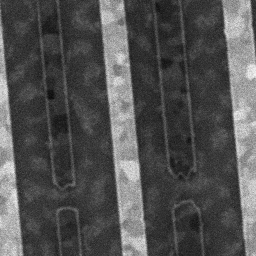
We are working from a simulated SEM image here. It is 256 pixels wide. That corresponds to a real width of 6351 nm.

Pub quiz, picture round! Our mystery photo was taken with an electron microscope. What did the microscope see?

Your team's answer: one or a few lines or trenches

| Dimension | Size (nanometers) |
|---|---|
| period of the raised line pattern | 1500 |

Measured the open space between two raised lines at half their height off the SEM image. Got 1050 nm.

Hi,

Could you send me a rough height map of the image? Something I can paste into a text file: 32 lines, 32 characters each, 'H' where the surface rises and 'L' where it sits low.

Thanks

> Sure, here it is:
LLLLLHHLLLLLLHHLLLLHHHHLLLLLHHHL
LLLLLHHLLLLLLHHHLLLHHHHLLLLLHHHL
LLLLLHHLLLLLLHHHLLLHHHHLLLLLHHHL
LLLLLHHHLLLLLHHHLLLHHHHLLLLLHHHL
LLLLLHHHLLLLLHHHLLLLHHHLLLLLHHHH
LLLLLHHHLLLLLHHHLLLLHHHLLLLLHHHH
LLLLLHHHLLLLLHHHLLLLHHHLLLLLLHHH
HLLLLHHHLLLLLHHHLLLLHHHLLLLLLHHH
HLLLLHHHLLLLLHHHLLLLHHHLLLLLLHHH
HLLLLLHHLLLLLHHHLLLLHHHLLLLLLHHH
HLLLLLHHLLLLLLHHLLLLHHHLLLLLLHHH
HLLLLLHHLLLLLLHHLLLLHHHHLLLLLHHH
HLLLLLHHLLLLLLHHHLLLHHHHLLLLLHHH
HLLLLLHHLLLLLLHHHLLLHHHHLLLLLHHH
HLLLLLHHHLLLLLHHHLLLHHHHLLLLLHHH
HLLLLLHHHLLLLLHHHLLLLHHHLLLLLHHH
HLLLLLHHHLLLLLHHHLLLLHHHLLLLLHHH
HLLLLLHHHLLLLLHHHLLLLHHHLLLLLLHH
HHLLLLHHHLLLLLHHHLLLLHHHLLLLLLHH
HHLLLLHHHLLLLLHHHLLLLHHHLLLLLLHH
HHLLLLLHHLLLLLHHHLLLLHHHLLLLLLHH
HHLLLLLHHLLLLLHHHLLLLHHHLLLLLLHH
HHLLLLLHHLLLLLLHHLLLLLLLLLLLLLHH
HHLLLLLLLLLLLLLHHHLLLLLLLLLLLLHH
HHLLLLLLLLLLLLLHHHLLLLLLLLLLLLHH
HHLLLLLLLLLLLLLHHHLLLLHHLLLLLLHH
HHLLLLLHHLLLLLLHHHLLLLHHHLLLLLHH
HHLLLLLHHHLLLLLHHHLLLLHHHLLLLLHH
HHLLLLLHHHLLLLLHHHLLLLHHHLLLLLHH
HHHLLLLHHHLLLLLHHHLLLLHHHLLLLLLH
HHHLLLLHHHLLLLLHHHLLLLHHHLLLLLLH
HHHLLLLLHHLLLLLLHHLLLLHHHLLLLLLH